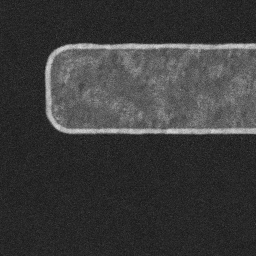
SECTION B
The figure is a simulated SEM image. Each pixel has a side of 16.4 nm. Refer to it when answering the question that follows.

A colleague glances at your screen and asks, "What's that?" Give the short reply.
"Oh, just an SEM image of one or a few lines or trenches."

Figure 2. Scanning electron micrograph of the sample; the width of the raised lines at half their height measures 1390 nm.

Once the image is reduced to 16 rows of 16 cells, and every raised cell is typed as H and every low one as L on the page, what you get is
LLLLLLLLLLLLLLLL
LLLLLLLLLLLLLLLL
LLLLLLLLLLLLLLLL
LLLHHHHHHHHHHHHH
LLLHHHHHHHHHHHHH
LLLHHHHHHHHHHHHH
LLLHHHHHHHHHHHHH
LLLHHHHHHHHHHHHH
LLLLLLLLLLLLLLLL
LLLLLLLLLLLLLLLL
LLLLLLLLLLLLLLLL
LLLLLLLLLLLLLLLL
LLLLLLLLLLLLLLLL
LLLLLLLLLLLLLLLL
LLLLLLLLLLLLLLLL
LLLLLLLLLLLLLLLL